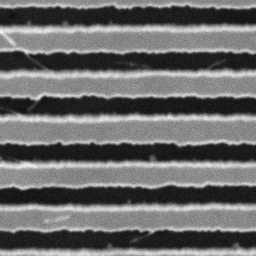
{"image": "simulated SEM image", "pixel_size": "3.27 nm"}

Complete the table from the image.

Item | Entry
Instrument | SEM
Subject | lines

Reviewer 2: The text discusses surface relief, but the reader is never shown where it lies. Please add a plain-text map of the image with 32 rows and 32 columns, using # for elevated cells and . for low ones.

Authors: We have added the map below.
################################
................................
................................
################################
################################
################################
...##################.###.#..###
................................
................................
################################
################################
################################
................................
................................
######..##.#####################
################################
################################
################################
................................
................................
################################
################################
################################
#.###....#........##............
................................
..........................#.....
################################
################################
################################
................................
................................
################################